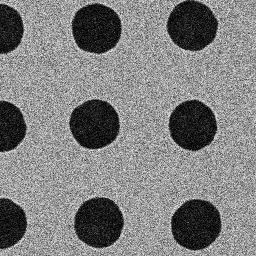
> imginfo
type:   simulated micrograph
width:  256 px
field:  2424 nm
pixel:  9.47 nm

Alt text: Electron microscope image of holes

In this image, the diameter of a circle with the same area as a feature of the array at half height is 50.5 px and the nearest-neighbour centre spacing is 921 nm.